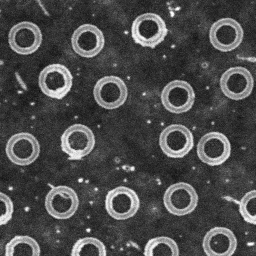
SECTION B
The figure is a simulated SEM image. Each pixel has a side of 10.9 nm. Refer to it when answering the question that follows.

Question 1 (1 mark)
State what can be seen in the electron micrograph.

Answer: a regular array of ring-shaped raised bodies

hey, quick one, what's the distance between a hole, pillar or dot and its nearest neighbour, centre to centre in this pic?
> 582 nanometres